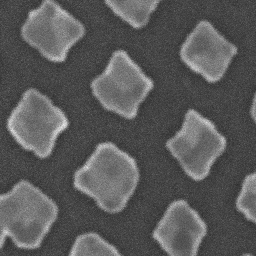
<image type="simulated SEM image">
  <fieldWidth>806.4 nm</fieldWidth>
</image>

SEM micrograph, raised bodies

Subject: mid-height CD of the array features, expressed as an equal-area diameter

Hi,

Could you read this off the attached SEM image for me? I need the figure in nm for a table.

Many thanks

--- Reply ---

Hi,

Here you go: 172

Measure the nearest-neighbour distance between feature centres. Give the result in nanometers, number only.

292